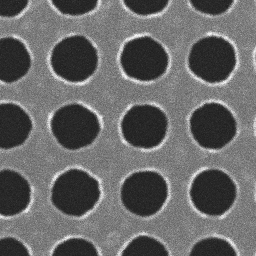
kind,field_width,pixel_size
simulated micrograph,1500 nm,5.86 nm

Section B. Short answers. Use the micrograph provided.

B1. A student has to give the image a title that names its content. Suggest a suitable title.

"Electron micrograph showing a regular array of holes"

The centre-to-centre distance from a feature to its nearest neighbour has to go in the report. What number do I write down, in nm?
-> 391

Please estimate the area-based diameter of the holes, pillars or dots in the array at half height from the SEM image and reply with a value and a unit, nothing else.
0.276 microns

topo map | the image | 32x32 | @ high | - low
---@@@@-----@@@------@@@-----@@@
---@@@@@---@@@@@@---@@@@@---@@@@
@@@@@@@@@@@@@@@@@@@@@@@@@@@@@@@@
@@@@@@@@@@@@@@@@@@@@@@@@@@@@@@@@
@@@@@@@@@-@@@@@@@@@@@@@@@@@@@@@@
---@@@@----@@@@@----@@@@-----@@@
----@@------@@@------@@@-----@@@
----@@------@@@------@@@------@@
----@@------@@@------@@@-----@@@
---@@@@----@@@@@----@@@@-----@@@
@@@@@@@@@@@@@@@@@@@@@@@@@@@@@@@@
@@@@@@@@@@@@@@@@@@@@@@@@@@@@@@@@
@@@@@@@@@@@@@@@@@@@@@@@@@@@@@@@@
---@@@@@---@@@@@----@@@@@---@@@@
----@@@-----@@@------@@@-----@@@
----@@------@@@------@@@------@@
----@@@-----@@@------@@@------@@
---@@@@-----@@@@----@@@@-----@@@
--@@@@@@--@@@@@@@--@@@@@@@--@@@@
@@@@@@@@@@@@@@@@@@@@@@@@@@@@@@@@
@@@@@@@@@@@@@@@@@@@@@@@@@@@@@@@@
--@@@@@@---@@@@@@---@@@@@---@@@@
---@@@@-----@@@@-----@@@-----@@@
----@@------@@@------@@@------@@
----@@------@@@------@@@------@@
----@@@-----@@@-----@@@@-----@@@
---@@@@@---@@@@@----@@@@@---@@@@
@@@@@@@@@@@@@@@@@@@@@@@@@@@@@@@@
@@@@@@@@@@@@@@@@@@@@@@@@@@@@@@@@
@@@@@@@@@@@@@@@@@-@@@@@@@@@@@@@@
---@@@@-----@@@@----@@@@-----@@@
----@@@-----@@@------@@@------@@